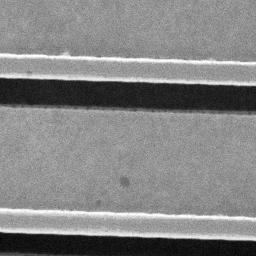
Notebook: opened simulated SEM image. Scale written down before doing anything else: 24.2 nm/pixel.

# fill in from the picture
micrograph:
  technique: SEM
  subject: lines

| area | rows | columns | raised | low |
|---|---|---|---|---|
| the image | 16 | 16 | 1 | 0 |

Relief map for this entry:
1111111111111111
1111111111111111
1111111111111111
1111111111111111
1111111111111111
0000000000000000
0000000000000000
1111111111111111
1111111111111111
1111111111111111
1111111111111111
1111111111111111
1111111111111111
1111111111111111
1111111111111111
0000000000000000